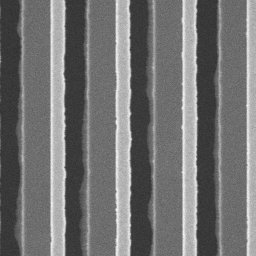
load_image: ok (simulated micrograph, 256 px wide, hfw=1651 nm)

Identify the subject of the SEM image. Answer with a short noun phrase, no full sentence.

lines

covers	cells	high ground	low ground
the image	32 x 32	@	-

---@@@@@---@@@@@---@@@@@@--@@@@@
---@@@@@---@@@@@---@@@@@@--@@@@@
---@@@@@---@@@@@---@@@@@@--@@@@@
---@@@@@---@@@@@---@@@@@@--@@@@@
---@@@@@---@@@@@---@@@@@@--@@@@@
---@@@@@---@@@@@---@@@@@@--@@@@@
---@@@@@---@@@@@---@@@@@@--@@@@@
---@@@@@---@@@@@---@@@@@@--@@@@@
---@@@@@---@@@@@---@@@@@@--@@@@@
---@@@@@---@@@@@---@@@@@@--@@@@@
---@@@@@---@@@@@---@@@@@@--@@@@@
---@@@@@---@@@@@---@@@@@@--@@@@@
---@@@@@---@@@@@---@@@@@@--@@@@@
---@@@@@---@@@@@---@@@@@@--@@@@@
---@@@@@---@@@@@---@@@@@@--@@@@@
---@@@@@---@@@@@---@@@@@@--@@@@@
---@@@@@---@@@@@---@@@@@@--@@@@@
---@@@@@---@@@@@---@@@@@@--@@@@@
---@@@@@---@@@@@---@@@@@@--@@@@@
---@@@@@---@@@@@---@@@@@@--@@@@@
---@@@@@---@@@@@---@@@@@@--@@@@@
---@@@@@---@@@@@---@@@@@@--@@@@@
---@@@@@---@@@@@---@@@@@@--@@@@@
---@@@@@---@@@@@---@@@@@@--@@@@@
---@@@@@---@@@@@---@@@@@@--@@@@@
---@@@@@---@@@@@---@@@@@@--@@@@@
---@@@@@---@@@@@---@@@@@@--@@@@@
---@@@@@---@@@@@---@@@@@@--@@@@@
---@@@@@---@@@@@---@@@@@@--@@@@@
---@@@@@---@@@@@---@@@@@@--@@@@@
---@@@@@---@@@@@---@@@@@@--@@@@@
---@@@@@---@@@@@---@@@@@@--@@@@@